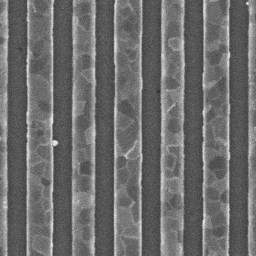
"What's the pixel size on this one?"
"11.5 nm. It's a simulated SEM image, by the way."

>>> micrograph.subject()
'lines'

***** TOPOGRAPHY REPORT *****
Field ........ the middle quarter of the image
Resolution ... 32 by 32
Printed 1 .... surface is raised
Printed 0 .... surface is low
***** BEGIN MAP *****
00011110000001111110000001111100
00011110000001111110000001111100
00011110000001111110000001111100
00011110000001111110000001111100
00011111000001111110000001111100
00011111000001111110000001111100
00011110000001111110000001111100
00011110000001111110000001111100
00011110000001111110000001111100
00011110000001111110000001111000
00011110000001111110000001111000
00011110000001111110000001111000
00111110000001111110000001111100
00111110000001111110000001111100
00111110000001111110000001111000
00111110000001111110000001111000
00111110000001111110000001111000
00011110000001111110000001111000
00011110000001111110000001111000
00011110000001111110000001111000
00011110000001111110000001111100
00011110000001111110000001111100
00011110000001111110000001111100
00011110000001111110000001111100
00011110000001111110000001111100
00011110000001111110000001111100
00011110000001111110000001111100
00011110000001111110000001111100
00011110000001111110000001111100
00011110000001111110000001111100
00011110000001111110000001111100
00011110000001111110000001111100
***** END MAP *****